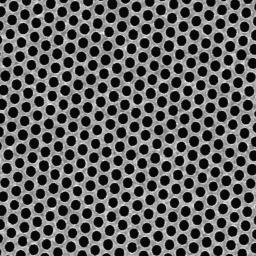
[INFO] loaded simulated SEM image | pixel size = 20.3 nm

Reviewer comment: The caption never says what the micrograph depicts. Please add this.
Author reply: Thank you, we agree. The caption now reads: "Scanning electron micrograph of a regular array of holes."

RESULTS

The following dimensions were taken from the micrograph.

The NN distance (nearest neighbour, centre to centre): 282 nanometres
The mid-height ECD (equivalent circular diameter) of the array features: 214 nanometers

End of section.